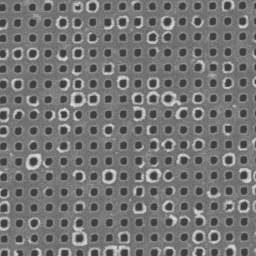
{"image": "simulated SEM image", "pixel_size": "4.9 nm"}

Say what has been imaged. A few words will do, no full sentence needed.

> a regular array of holes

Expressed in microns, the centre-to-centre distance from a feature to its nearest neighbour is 0.0732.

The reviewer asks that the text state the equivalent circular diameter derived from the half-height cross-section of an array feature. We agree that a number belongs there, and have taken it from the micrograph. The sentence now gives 37.9 nm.